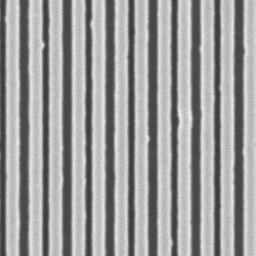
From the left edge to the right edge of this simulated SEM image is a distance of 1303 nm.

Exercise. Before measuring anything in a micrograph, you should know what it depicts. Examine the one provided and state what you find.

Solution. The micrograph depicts parallel lines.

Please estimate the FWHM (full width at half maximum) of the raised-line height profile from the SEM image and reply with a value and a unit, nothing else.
13.2 pixels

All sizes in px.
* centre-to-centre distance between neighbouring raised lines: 21.4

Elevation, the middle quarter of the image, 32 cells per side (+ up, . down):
..+++..+++...+++..+++...+++.++++
..+++..+++...+++..+++...+++..+++
..+++..+++...+++..+++...+++.++++
..+++..+++...+++..+++...+++.++++
..+++..+++...+++..+++...+++.++++
..+++..+++...+++..+++...+++.++++
..+++..+++...+++..+++...+++.++++
..+++..+++...+++..+++...+++.++++
..+++..+++...+++..+++...+++..+++
..+++..+++...+++..+++...+++..+++
..+++..+++...+++..+++...+++.++++
..+++..+++...+++..+++...+++.++++
..+++..+++...+++..+++...+++..+++
..+++..+++...+++..+++...+++..+++
..+++..+++...+++..+++...+++..+++
..+++..+++...+++..+++...+++..+++
..+++..+++...+++..+++...+++..+++
..+++..+++...+++..+++...+++..+++
..+++..+++...+++..+++...+++..+++
..+++..+++...+++..+++...+++..+++
..+++..+++...+++..+++...+++..+++
..+++..+++...+++..+++...+++..+++
..+++..+++...+++..+++...+++..+++
..+++..+++...+++..+++...+++..+++
..+++..+++...+++..+++...+++..+++
..+++..+++...+++..+++...+++..+++
..+++..+++...+++..+++...+++..+++
..+++..+++...+++..+++...+++..+++
..+++..+++...+++..+++...+++.++++
..+++..+++...+++..+++...+++.++++
..+++..+++...+++..+++...+++..+++
..+++..+++...+++..+++...+++..+++